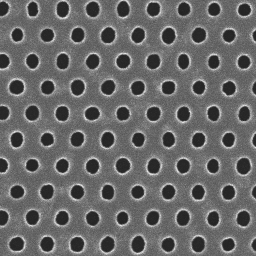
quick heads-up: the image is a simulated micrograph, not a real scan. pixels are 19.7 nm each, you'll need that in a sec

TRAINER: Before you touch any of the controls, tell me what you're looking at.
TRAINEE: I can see a regular array of holes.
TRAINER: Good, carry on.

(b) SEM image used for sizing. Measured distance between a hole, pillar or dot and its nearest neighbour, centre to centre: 0.589 microns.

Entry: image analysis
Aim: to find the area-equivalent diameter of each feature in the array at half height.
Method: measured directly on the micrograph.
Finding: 0.277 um